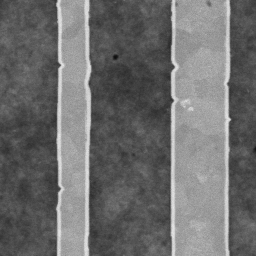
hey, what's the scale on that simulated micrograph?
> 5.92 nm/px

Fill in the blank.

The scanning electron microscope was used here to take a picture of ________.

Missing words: one or a few lines or trenches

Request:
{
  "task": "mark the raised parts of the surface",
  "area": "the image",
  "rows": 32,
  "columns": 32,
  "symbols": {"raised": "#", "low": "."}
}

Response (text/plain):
.......####...........######....
.......####...........######....
.......####...........######....
........###...........######....
........###...........######....
.......####...........######....
.......####...........######....
........###...........######....
........###...........######....
........###...........######....
........###...........######....
........###...........######....
.......####...........######....
.......####...........######....
.......####...........######....
.......####...........######....
.......####...........######....
.......####...........######....
.......####...........######....
.......####...........######....
........###...........######....
........###...........######....
........###...........######....
........###...........######....
........###...........######....
.......####...........######....
.......####...........######....
.......####...........######....
.......####...........######....
.......####...........######....
.......####...........######....
.......####...........######....